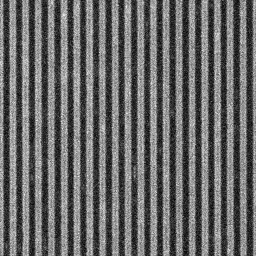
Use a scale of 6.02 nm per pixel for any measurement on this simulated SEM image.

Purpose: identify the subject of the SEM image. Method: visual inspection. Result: parallel lines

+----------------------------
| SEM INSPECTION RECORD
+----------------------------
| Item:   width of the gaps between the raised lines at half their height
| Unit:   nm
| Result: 41.4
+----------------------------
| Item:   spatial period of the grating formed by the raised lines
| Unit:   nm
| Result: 77.1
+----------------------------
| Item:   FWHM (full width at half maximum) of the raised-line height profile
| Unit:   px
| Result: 5.75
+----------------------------